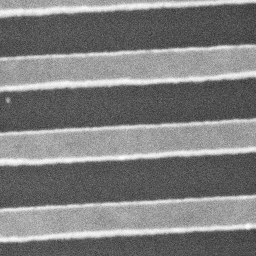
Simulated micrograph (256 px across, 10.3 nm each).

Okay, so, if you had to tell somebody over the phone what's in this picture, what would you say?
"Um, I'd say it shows lines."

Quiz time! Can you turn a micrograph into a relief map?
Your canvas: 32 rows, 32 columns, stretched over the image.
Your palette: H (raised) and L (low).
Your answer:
HHHHHHHHHHHHHHHHHHHHHHHHHHLLLLLL
HHHHHHLLLLLLLLLLLLLLLLLLLLLLLLLL
LLLLLLLLLLLLLLLLLLLLLLLLLLLLLLLL
LLLLLLLLLLLLLLLLLLLLLLLLLLLLLLLL
LLLLLLLLLLLLLLLLLLLLLLLLLLLLLLLL
LLLLLLLLLLLLLLLLLLLLLLLLLLLLLLLL
LLLLLLLLLLLLLLLHHHHHHHHHHHHHHHHH
HHHHHHHHHHHHHHHHHHHHHHHHHHHHHHHH
HHHHHHHHHHHHHHHHHHHHHHHHHHHHHHHH
HHHHHHHHHHHHHHHHHHHHHHHHHHHHHHHL
HHHHHHHHHHHHHLLLLLLLLLLLLLLLLLLL
LLLLLLLLLLLLLLLLLLLLLLLLLLLLLLLL
LLLLLLLLLLLLLLLLLLLLLLLLLLLLLLLL
LLLLLLLLLLLLLLLLLLLLLLLLLLLLLLLL
LLLLLLLLLLLLLLLLLLLLLLLLLLLLLLLL
LLLLLLLLLLLLLLLLLLLLLLHHHHHHHHHH
LLHHHHHHHHHHHHHHHHHHHHHHHHHHHHHH
HHHHHHHHHHHHHHHHHHHHHHHHHHHHHHHH
HHHHHHHHHHHHHHHHHHHHHHHHHHHHHHHH
HHHHHHHHHHHHHHHHHHHHLLLLLLLLLLLL
LLLLLLLLLLLLLLLLLLLLLLLLLLLLLLLL
LLLLLLLLLLLLLLLLLLLLLLLLLLLLLLLL
LLLLLLLLLLLLLLLLLLLLLLLLLLLLLLLL
LLLLLLLLLLLLLLLLLLLLLLLLLLLLLLLL
LLLLLLLLLLLLLLLLLLLLLLLLLLLLLLLH
LLLLLLLLLLLLHHHHHHHHHHHHHHHHHHHH
HHHHHHHHHHHHHHHHHHHHHHHHHHHHHHHH
HHHHHHHHHHHHHHHHHHHHHHHHHHHHHHHH
HHHHHHHHHHHHHHHHHHHHHHHHHHHHHLLL
HHHHHHHHHLLLLLLLLLLLLLLLLLLLLLLL
LLLLLLLLLLLLLLLLLLLLLLLLLLLLLLLL
LLLLLLLLLLLLLLLLLLLLLLLLLLLLLLLL